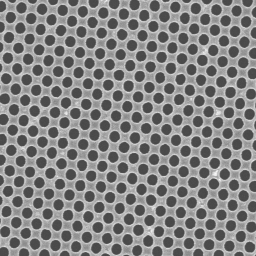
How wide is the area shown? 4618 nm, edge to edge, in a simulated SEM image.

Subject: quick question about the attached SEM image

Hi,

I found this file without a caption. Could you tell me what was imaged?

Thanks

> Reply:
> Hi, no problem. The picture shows a regular array of holes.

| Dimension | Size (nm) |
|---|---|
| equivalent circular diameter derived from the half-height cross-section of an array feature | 200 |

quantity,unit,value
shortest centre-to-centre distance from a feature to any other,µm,0.257